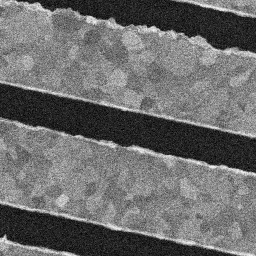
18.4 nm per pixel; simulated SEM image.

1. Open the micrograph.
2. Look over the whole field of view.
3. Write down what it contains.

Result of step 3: one or a few lines or trenches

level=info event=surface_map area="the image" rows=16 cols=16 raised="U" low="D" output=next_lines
UUDDDDDDDDDDDUUU
UUUUUUUDDDDDDDDD
UUUUUUUUUUUUDDDD
UUUUUUUUUUUUUUUU
UUUUUUUUUUUUUUUU
DDUUUUUUUUUUUUUU
DDDDDDDUUUUUUUUU
DDDDDDDDDDDUUUUU
UUUUUDDDDDDDDDDD
UUUUUUUUUDDDDDDD
UUUUUUUUUUUUUUDD
UUUUUUUUUUUUUUUU
UUUUUUUUUUUUUUUU
DDDDUUUUUUUUUUUU
DDDDDDDDDUUUUUUU
UUDDDDDDDDDDDUUU